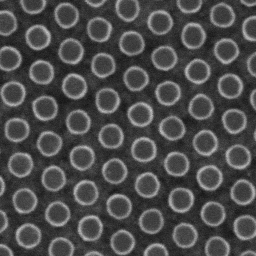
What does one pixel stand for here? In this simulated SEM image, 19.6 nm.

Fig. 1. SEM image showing a regular array of raised bodies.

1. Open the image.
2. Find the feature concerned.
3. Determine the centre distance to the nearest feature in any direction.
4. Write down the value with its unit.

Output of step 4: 0.694 um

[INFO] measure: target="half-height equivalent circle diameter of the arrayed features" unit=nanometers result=468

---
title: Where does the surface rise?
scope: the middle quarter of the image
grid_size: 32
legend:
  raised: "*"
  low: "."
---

.......******..........****....*
.......******...****..........**
........****...******.........**
.***...........******..........*
*****..........******....**.....
******..........****...*****....
*****....***.....**....******...
*****...*****..........******...
..**....******.........*****....
........******..........****....
........*****....****..........*
.........****...******.........*
.****...........******..........
.*****..........******....**....
.*****...........****....****...
.*****.....**...........******..
.*****...*****..........******..
.........******..........*****..
.........******...........***...
.........*****....****..........
..........****...******.........
..*****..........******.........
..*****..........******....**...
..*****...........****....*****.
..*****....***...........******.
...****...*****..........******.
..........******..........*****.
..........******....**.....***..
..........*****....****.........
.....**....***....*****.........
...*****..........******........
...*****..........*****.....**..